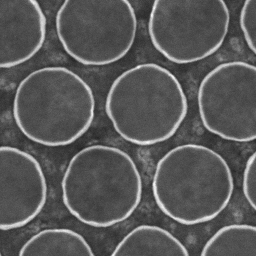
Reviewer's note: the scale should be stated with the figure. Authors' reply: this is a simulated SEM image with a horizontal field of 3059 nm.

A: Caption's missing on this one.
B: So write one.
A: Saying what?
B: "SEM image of raised bodies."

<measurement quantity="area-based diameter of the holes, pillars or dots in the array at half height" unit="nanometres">934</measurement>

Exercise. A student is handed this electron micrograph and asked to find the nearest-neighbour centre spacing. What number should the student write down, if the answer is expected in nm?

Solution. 1090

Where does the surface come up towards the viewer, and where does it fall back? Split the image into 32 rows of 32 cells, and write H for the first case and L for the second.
HHHHLLLLHHHHHHHHLLLHHHHHHHHHLLLH
HHHHHLLHHHHHHHHHHLLHHHHHHHHHLLHH
HHHHHLLHHHHHHHHHHLLHHHHHHHHHHLHH
HHHHHLLHHHHHHHHHHLLHHHHHHHHHLLHH
HHHHHLLHHHHHHHHHHLLHHHHHHHHHLLLH
HHHHHLLLHHHHHHHHLLLHHHHHHHHLLLLH
HHHHLLLLLHHHHHHHLLLLHHHHHHLLLLLL
HHHLLLLLLLHHHHHLLLLLLLHHLLLLLLLL
LLLLLLLLLLLLLLLLLHHHLLLLLLLHHHHH
LLLLHHHHHHLLLLLHHHHHHHLLLLHHHHHH
LLLHHHHHHHHLLLHHHHHHHHLLLHHHHHHH
LLHHHHHHHHHLLLHHHHHHHHHLLHHHHHHH
LLHHHHHHHHHHLHHHHHHHHHHLLHHHHHHH
LLHHHHHHHHHHLHHHHHHHHHHLLHHHHHHH
LLHHHHHHHHHHLLHHHHHHHHHLLHHHHHHH
LLHHHHHHHHHLLLHHHHHHHHLLLLHHHHHH
LLLHHHHHHHLLLLLHHHHHHHLLLLLHHHHH
LLLLHHHHHLLLLLLLHHHHLLLLLLLLLHHL
LLLLLLLLLLLHHHLLLLLLLLHHHHLLLLLL
HHHHLLLLLHHHHHHHLLLLLHHHHHHLLLLL
HHHHHLLLLHHHHHHHHLLLHHHHHHHHLLLH
HHHHHLLLHHHHHHHHHLLLHHHHHHHHHLLH
HHHHHLLLHHHHHHHHHLLHHHHHHHHHHLLH
HHHHHHLLHHHHHHHHHHLHHHHHHHHHHLLH
HHHHHHLLHHHHHHHHHLLHHHHHHHHHHLLH
HHHHHLLLHHHHHHHHHLLLHHHHHHHHLLLH
HHHHHLLLLHHHHHHHLLLLLHHHHHHLLLLL
HHHHLLLLLLHHHHHLLLLLLLHHHLLLLLLL
LLLLLLLLLLLLLLLLLHHHLLLLLLLLHHHH
LLLLHHHHHHLLLLLLHHHHHLLLLLLHHHHH
LLLHHHHHHHHLLLLHHHHHHHLLLLHHHHHH
LLLHHHHHHHHLLLHHHHHHHHHLLHHHHHHH